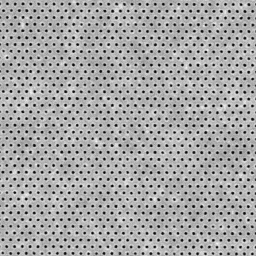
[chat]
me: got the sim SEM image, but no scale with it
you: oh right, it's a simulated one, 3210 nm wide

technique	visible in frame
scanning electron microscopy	a regular array of holes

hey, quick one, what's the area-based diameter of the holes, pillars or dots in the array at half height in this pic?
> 37.4 nm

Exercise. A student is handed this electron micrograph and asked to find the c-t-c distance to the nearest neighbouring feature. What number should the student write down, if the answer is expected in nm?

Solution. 94.9